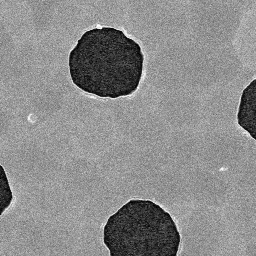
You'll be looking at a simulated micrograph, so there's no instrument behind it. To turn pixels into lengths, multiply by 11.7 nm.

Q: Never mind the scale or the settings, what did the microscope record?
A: holes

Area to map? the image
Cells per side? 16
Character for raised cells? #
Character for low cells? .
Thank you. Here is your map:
################
################
#####...########
####.....#######
####.....#######
#####...#######.
###############.
###############.
################
################
################
.###############
.###############
#######....#####
######.....#####
#######....#####